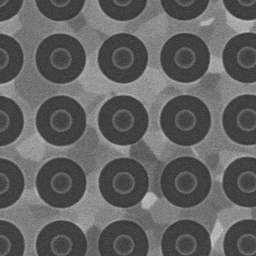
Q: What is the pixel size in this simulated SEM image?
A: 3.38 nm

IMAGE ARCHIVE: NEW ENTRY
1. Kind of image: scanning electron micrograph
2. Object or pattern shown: an array of small figures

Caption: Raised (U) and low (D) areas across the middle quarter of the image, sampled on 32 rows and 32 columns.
UDDDDUUUUDDDDUUUUDDDDUUUDDDDDUUU
DDDDDUUUUDDDDDDDDDDDUUUUUDDDDDDD
DDDDUUUUUUDDDDDDDDDDUUUUUDDDDDDD
DDDUUUUUUUUDDDDDDDDUUUUUUUDDDDDD
DDUUUUUUUUUUDDDDDUUUUUUUUUUUDDDD
UUUUUUUUUUUUUUUUUUUUUUUUUUUUUUUU
UUUUUUUUUUUUUUUUUUUUUUUUUUUUUUUU
UUUUUUUUUUUUUUUUUUUUUUUUUUUUUUDU
DDUUUUUUUUUUDDDDDDUUUUUUUUUDDDDD
DDDDUUUUUUDDDDDDDDDUUUUUUUDDDDDD
DDDDDUUUUDDDDDDDDDDDUUUUUDDDDDDD
DDDDDUUUUDDDDDUDDDDDDUUUDDDDDDDD
UDDDDUUUDDDDDUUUUDDDDUUUDDDDUUUU
UUDDDDUUDDDDUUUUUDDDDUUUDDDDUUUU
UUDDDDUUDDDDUUUUUDDDDUUUDDDDUUUU
UUDDDDUUDDDDDUUUUDDDDUUUDDDDUUUU
UDDDDUUUUDDDDDUUDDDDDUUUDDDDDDUD
DDDDDUUUUDDDDDDDDDDDUUUUUDDDDDDD
DDDDUUUUUUDDDDDDDDDDUUUUUUDDDDDD
DDDUUUUUUUUDDDDDDDUUUUUUUUUDDDDD
DUUUUUUUUUUUUUDDUUUUUUUUUUUUUDDD
UUUUUUUUUUUUUUUUUUUUUUUUUUUUUUUU
UUUUUUUUUUUUUUUUUUUUUUUUUUUUUUUU
DUUUUUUUUUUUUDDDDUUUUUUUUUUUDDDD
DDDUUUUUUUUDDDDDDDDUUUUUUUDDDDDD
DDDDUUUUUUDDDDDDDDDDUUUUUDDDDDDD
DDDDDUUUUDDDDDDDDDDDDUUUUDDDDDDD
UDDDDUUUUDDDDUUUDDDDDUUUDDDDDUUU
UUDDDDUUUDDDUUUUUDDDDUUUDDDDUUUU
UUDDDDUUDDDDUUUUUDDDDUUUDDDDUUUU
UUDDDDUUUDDDUUUUUDDDDUUUDDDDUUUU
UDDDDUUUUDDDDUUUUDDDDUUUDDDDUUUU